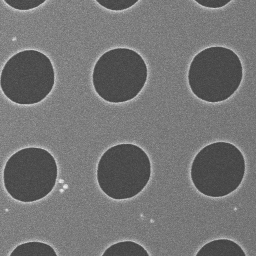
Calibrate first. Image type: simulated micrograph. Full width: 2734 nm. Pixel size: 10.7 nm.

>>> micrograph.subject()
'holes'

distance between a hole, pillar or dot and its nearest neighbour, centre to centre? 1010 nm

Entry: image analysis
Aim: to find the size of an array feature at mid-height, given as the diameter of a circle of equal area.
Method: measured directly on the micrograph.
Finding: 54.9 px